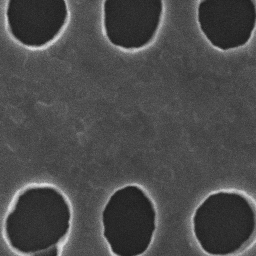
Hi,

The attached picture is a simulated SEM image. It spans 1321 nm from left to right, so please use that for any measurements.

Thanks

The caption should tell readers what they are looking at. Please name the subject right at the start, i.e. holes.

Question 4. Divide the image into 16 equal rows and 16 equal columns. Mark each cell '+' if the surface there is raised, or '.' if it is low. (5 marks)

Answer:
....++....++....
+...+++...++....
+..++++..++++..+
++++++++++++++++
++++++++++++++++
++++++++++++++++
++++++++++++++++
++++++++++++++++
++++++++++++++++
++++++++++++++++
++++++++++++++++
++++++++++++++++
+...+++..++++..+
+...++....++....
....++....++....
+...+++..++++..+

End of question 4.